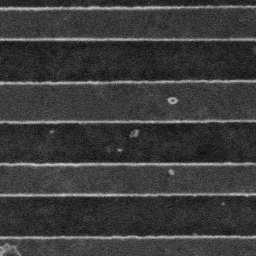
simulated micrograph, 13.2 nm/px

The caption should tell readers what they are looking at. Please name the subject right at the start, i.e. lines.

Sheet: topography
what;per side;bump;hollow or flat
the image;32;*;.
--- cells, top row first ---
................................
********************************
********************************
********************************
********************************
................................
................................
................................
................................
................................
********************************
********************************
********************************
********************************
********************************
................................
................................
................................
................................
................................
*.**...*************************
********************************
********************************
********************************
................................
................................
................................
................................
................................
................................
********************************
********************************